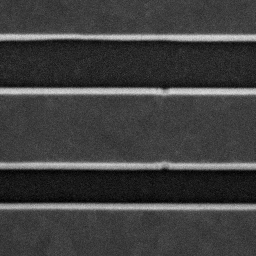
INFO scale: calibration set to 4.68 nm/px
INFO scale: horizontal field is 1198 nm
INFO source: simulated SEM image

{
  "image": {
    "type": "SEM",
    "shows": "one or a few lines or trenches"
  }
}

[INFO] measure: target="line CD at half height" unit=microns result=0.353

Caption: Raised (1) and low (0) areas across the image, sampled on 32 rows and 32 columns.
11111111111111111111111111111111
11111111111111111111111111111111
11111111111111111111111111111111
11111111111111111111111111111111
11111111111111111111111111111111
00000000000000000000000000000000
00000000000000000000000000000000
00000000000000000000000000000000
00000000000000000000000000000000
00000000000000000000000000000000
00000000000000000000000000000000
11111111111111111111011000000000
11111111111111111111111111111111
11111111111111111111111111111111
11111111111111111111111111111111
11111111111111111111111111111111
11111111111111111111111111111111
11111111111111111111111111111111
11111111111111111111111111111111
11111111111111111111111111111111
11111111111111111111111111111111
00000000000000000000000000000000
00000000000000000000000000000000
00000000000000000000000000000000
00000000000000000000000000000000
00000000000000000000000000000000
11111111111111111111111111111111
11111111111111111111111111111111
11111111111111111111111111111111
11111111111111111111111111111111
11111111111111111111111111111111
11111111111111111111111111111111